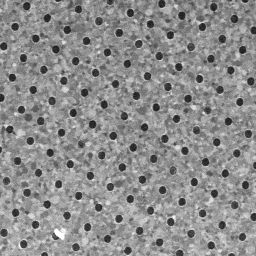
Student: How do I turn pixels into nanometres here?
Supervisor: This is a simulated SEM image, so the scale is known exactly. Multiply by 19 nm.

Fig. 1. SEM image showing a regular array of holes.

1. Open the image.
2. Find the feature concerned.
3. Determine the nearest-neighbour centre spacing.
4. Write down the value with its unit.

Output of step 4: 0.433 micrometres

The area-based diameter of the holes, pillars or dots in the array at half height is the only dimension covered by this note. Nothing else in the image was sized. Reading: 0.159 micrometres